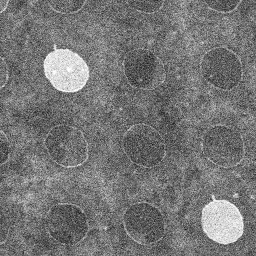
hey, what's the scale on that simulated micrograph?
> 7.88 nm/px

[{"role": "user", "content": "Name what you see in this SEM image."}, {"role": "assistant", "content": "a regular array of raised bodies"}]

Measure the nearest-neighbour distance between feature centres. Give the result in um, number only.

0.602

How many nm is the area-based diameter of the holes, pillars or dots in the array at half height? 335